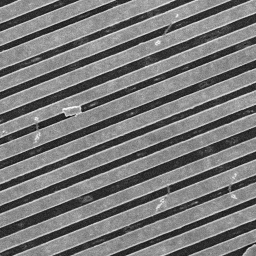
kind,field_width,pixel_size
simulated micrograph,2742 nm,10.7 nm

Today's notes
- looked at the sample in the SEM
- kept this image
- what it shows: parallel lines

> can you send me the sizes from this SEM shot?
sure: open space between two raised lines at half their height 78.5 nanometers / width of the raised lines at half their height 137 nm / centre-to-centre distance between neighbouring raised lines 0.229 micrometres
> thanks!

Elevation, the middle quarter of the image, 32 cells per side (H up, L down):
LLLLLLHHHHHHHHHLLLLLLHHHHHHHHLLL
LLLHHHHHHHHHLLLLLLHHHHHHHHLLLLLH
HHHHHHHHHHLLLLLLHHHHHHHHLLLLLHHH
HHHHHHHLLLLLLHHHHHHHHLLLLLHHHHHH
HHHHLLLLLLLHHHHHHHHLLLLLHHHHHHHH
HHLLLLLLHHHHHHHHLLLLLHHHHHHHHHHH
LLLLLLHHHHHHHHLLLLLHHHHHHHHHHLLL
LLLHHHHHHHHLLLLLHHHHHHHHHHHLLLLL
LHHHHHHHHLLLLLHHHHHHHHHHLLLLLHHH
HHHHHHLLLLLHHHHHHHHHHHLLLLLHHHHH
HHHHLLLLLHHHHHHHHHHLLLLLHHHHHHHH
HHHHLLHHHHHHHHHHHLLLLLHHHHHHHHHL
HHHHHHHHHHHHHHLLLLLHHHHHHHHHLLLL
LHHHHHHHHHHLLLLLLHHHHHHHHHLLLLLH
HHHHHHHHLLLLLLHHHHHHHHHLLLLLHHHH
HHHHHHLLLLLHHHHHHHHHHLLLLLHHHHHH
HHHHLLLLLHHHHHHHHHLLLLLHHHHHHHHH
HLLLLLHHHHHHHHHLLLLLLHHHHHHHHLLL
LLLLHHHHHHHHHLLLLLHHHHHHHHHLLLLL
LHHHHHHHHHLLLLLLHHHHHHHHLLLLLLHH
HHHHHHHLLLLLLHHHHHHHHHLLLLLHHHHH
HHHHHLLLLLLHHHHHHHHLLLLLLHHHHHHH
HHHLLLLLHHHHHHHHLLLLLLHHHHHHHHHL
LLLLLHHHHHHHHHLLLLLLHHHHHHHHLLLL
LLLHHHHHHHHLLLLLLHHHHHHHHHLLLLLL
HHHHHHHHHLLLLLLHHHHHHHHLLLLLLLHH
HHHHHHLLLLLLHHHHHHHHHLLLLLLHHHHH
HHHHLLLLLLHHHHHHHHLLLLLLLHHHHHHH
HLLLLLLHHHHHHHHHLLLLLLHHHHHHHHHL
LLLLHHHHHHHHHLLLLLLLHHHHHHHHLLLL
LLHHHHHHHHLLLLLLLHHHHHHHHHLLLLLL
HHHHHHHHLLLLLLLHHHHHHHHLLLLLLHHH